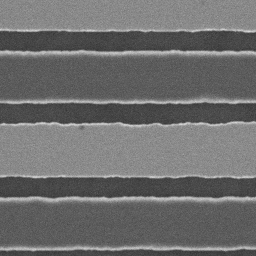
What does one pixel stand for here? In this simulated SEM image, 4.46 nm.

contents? lines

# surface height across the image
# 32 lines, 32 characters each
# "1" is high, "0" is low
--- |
11111111111111111111111111111111
11111111111111111111111111111111
11111111111111111111111111111111
11111111111111111111111111111111
00000000000000000000000000000000
00000000000000000000000000000000
11000001011100001111111111001000
11111111111111111111111111111111
11111111111111111111111111111111
11111111111111111111111111111111
11111111111111111111111111111111
11111111111111111111111111111111
11111111111111111111111111111111
00000000000000000000000000000000
00000000000000000000000000000000
10111111011111110001001111011111
11111111111111111111111111111111
11111111111111111111111111111111
11111111111111111111111111111111
11111111111111111111111111111111
11111111111111111111111111111111
11111111111111111111111111111111
00000000000000000000000000000000
00000000000000000000000000000000
00000000000000000000000000000000
11111111111111111111111111111111
11111111111111111111111111111111
11111111111111111111111111111111
11111111111111111111111111111111
11111111111111111111111111111111
11111111111111111111111111111111
00000000000000000000000000000000